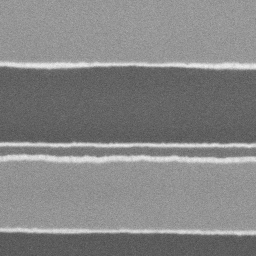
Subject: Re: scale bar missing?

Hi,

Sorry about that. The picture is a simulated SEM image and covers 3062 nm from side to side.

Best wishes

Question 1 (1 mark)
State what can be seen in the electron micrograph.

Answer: lines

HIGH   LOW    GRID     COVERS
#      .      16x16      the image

################
################
################
################
................
................
................
................
................
################
################
################
################
################
................
................